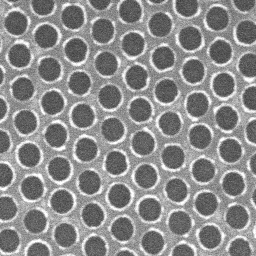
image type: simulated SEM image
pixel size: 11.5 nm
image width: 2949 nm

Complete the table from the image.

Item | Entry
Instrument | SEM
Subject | a regular array of holes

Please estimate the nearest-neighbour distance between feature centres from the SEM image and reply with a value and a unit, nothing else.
0.378 microns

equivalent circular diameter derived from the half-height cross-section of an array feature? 0.28 µm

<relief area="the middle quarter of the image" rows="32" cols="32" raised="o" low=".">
oooooooo......ooo..oooo....ooo..
oooooooo.....ooo.....ooo.oooo...
oo....ooo...ooo......oooooooo...
o......oooooooo......ooooooooo..
o......ooooooooo.....ooo....ooo.
o......ooo...ooo....ooo.....oooo
oo....ooo.....ooo.ooooo......ooo
oo...oooo.....ooooooooo......ooo
ooooooooo.....oooo..ooo.....ooo.
ooooooooo.....ooo....ooo...oooo.
ooo...ooo.....oo......oooooooo..
oo.....ooooooooo......ooooooooo.
oo......oooooooo......ooo...ooo.
oo......ooo..oooo....ooo.....ooo
oo.....ooo....oooo..ooo......ooo
ooo....oo......ooooooooo.....ooo
.oooooooo......ooooooooo.....oo.
.oooooooo......ooo....ooo...ooo.
.ooo...ooo....ooo......oooooooo.
ooo.....ooo..oooo......oooooooo.
ooo.....ooooooooo......ooo...ooo
ooo......oooooooo.....ooo.....oo
ooo.....ooo....ooo...ooo......oo
ooo.....oo......oooooooo......oo
.oooo.oooo......ooooooooo.....oo
..oooooooo......ooo...ooo.....oo
..oooo.ooo......oo.....oooo.oooo
..oo....oooo..oooo.....ooooooooo
.ooo.....ooooooooo.....oooo..ooo
oooo.....ooooooooo.....ooo....oo
oooo.....ooo...oooo....oo......o
.ooo.....oo.....ooooooooo......o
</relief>